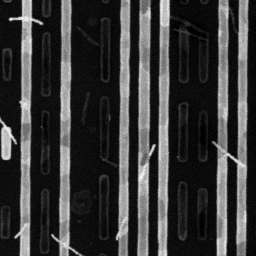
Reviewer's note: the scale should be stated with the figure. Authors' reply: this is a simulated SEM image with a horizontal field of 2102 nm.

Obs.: wiring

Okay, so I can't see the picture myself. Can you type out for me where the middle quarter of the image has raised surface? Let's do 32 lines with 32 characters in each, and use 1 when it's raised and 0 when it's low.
10000000001000010001100011000110
10000000001000110001100011000110
10000000001000110001100011000110
10000000001000110001100011000110
10000000000000110001100011000110
10000000000000110001100011000000
10000000000000110001100011000000
10000000000000110001100011000000
10000000000000110001100011000000
10000000011000110001100011000000
10000000011000110001100011000110
10000000011000110001100011000110
10000000011000110001100011000110
10000000011000110001100011000110
10000000011000110001100011000110
10000000011000110001100011000110
10000000011000110001100011000110
10000000011000110001100011000110
10000000011000110001100011000110
10000000011000110001100011000110
10000000011000110001100011000110
10000000011000110001100011000110
10000000011000110001110011000110
10000000011000110001100011000110
10000000000000110001100011000000
10000000000000110001100011000000
10000000000000110001100011000000
10000000000000110001100011000000
10000000011000110001100011000000
10000000011000110001100011000000
10000000011000110001100011000110
10000000011000110001100010000110